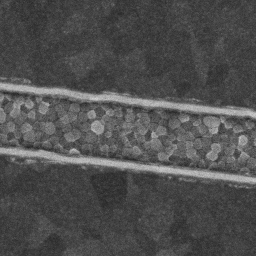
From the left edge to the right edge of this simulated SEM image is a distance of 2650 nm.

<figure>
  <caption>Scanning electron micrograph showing one or a few lines or trenches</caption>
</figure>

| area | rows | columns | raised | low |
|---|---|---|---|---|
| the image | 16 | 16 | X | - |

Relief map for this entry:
XXXXXXXXXXXXXXXX
XXXXXXXXXXXXXXXX
XXXXXXXXXXXXXXXX
XXXXXXXXXXXXXXXX
XXXXXXXXXXXXXXXX
-XXXXXXXXXXXXXXX
----------XXXXXX
----------------
----------------
X---------------
XXXXXXXXX-------
XXXXXXXXXXXXXXXX
XXXXXXXXXXXXXXXX
XXXXXXXXXXXXXXXX
XXXXXXXXXXXXXXXX
XXXXXXXXXXXXXXXX